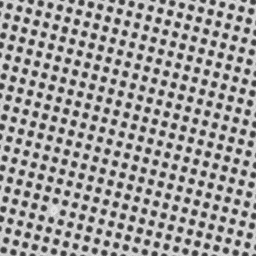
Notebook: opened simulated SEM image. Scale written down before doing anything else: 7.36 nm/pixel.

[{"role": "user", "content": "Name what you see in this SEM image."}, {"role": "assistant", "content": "a regular array of holes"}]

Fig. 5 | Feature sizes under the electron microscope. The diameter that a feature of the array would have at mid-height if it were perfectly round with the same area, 7.13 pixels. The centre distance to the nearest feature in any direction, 0.0714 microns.